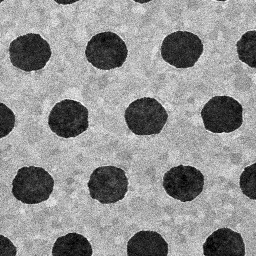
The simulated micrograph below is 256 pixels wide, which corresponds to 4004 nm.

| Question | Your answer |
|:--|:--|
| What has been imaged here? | a regular array of holes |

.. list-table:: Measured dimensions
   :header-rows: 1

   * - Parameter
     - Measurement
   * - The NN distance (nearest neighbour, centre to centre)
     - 1180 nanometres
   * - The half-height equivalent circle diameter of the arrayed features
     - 40.8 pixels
